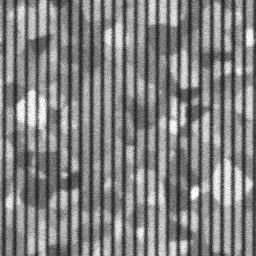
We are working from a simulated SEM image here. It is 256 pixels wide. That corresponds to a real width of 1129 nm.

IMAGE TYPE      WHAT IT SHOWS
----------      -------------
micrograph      parallel lines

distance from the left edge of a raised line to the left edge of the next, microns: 0.048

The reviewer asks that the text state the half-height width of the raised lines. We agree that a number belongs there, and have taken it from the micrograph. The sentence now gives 28.1 nanometres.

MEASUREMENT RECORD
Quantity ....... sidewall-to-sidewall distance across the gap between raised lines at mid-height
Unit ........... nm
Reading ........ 19.8